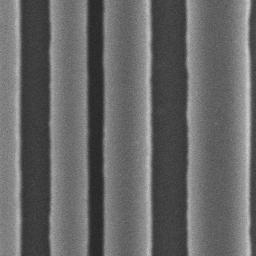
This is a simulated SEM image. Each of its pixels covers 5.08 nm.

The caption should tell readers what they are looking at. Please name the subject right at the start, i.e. lines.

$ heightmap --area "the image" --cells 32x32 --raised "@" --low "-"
@@----@@@@@--@@@@@@----@@@@@@@@-
@@----@@@@@--@@@@@@----@@@@@@@@-
@@----@@@@@--@@@@@@-----@@@@@@@-
@@----@@@@@--@@@@@@-----@@@@@@@-
@@----@@@@@--@@@@@@----@@@@@@@@-
@@----@@@@@--@@@@@@----@@@@@@@@-
@@----@@@@@--@@@@@@-----@@@@@@@-
@@----@@@@@--@@@@@@----@@@@@@@@-
@@-----@@@@--@@@@@@----@@@@@@@@-
@@-----@@@@--@@@@@@-----@@@@@@@-
@@----@@@@@--@@@@@@-----@@@@@@@-
@@----@@@@@--@@@@@@-----@@@@@@@-
@@----@@@@@--@@@@@@-----@@@@@@@-
@@----@@@@@--@@@@@@-----@@@@@@@-
@@----@@@@@--@@@@@@-----@@@@@@@-
@@----@@@@@--@@@@@@-----@@@@@@@-
@@----@@@@@--@@@@@@-----@@@@@@@-
@@----@@@@@--@@@@@@-----@@@@@@@-
@@-----@@@@--@@@@@@-----@@@@@@@-
@@----@@@@@--@@@@@@-----@@@@@@@-
@@-----@@@@--@@@@@@-----@@@@@@@-
@@-----@@@@--@@@@@@-----@@@@@@@-
@@-----@@@@--@@@@@@-----@@@@@@@-
@@-----@@@@--@@@@@@-----@@@@@@@-
@@-----@@@@--@@@@@@-----@@@@@@@-
@@----@@@@@--@@@@@@-----@@@@@@@-
@@----@@@@@--@@@@@@-----@@@@@@@-
@@----@@@@@--@@@@@@-----@@@@@@@-
@@----@@@@@--@@@@@@-----@@@@@@@-
@@----@@@@@--@@@@@@-----@@@@@@@-
@@----@@@@@--@@@@@@-----@@@@@@@-
@@----@@@@@--@@@@@@-----@@@@@@@-